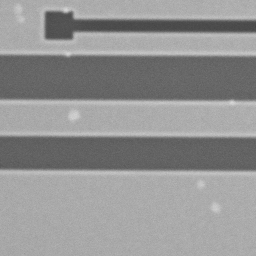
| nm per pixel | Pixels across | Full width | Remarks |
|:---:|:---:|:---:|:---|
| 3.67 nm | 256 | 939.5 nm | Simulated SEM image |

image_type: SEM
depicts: groups of lines, slits or small figures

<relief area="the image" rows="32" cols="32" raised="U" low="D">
UUUUUUUUUUUUUUUUUUUUUUUUUUUUUUUU
UUUUUUDDDUUUUUUUUUUUUUUUUUUUUUUU
UUUUUDDDDDDDDDDDDDDDDDDDDDDDDDDD
UUUUUDDDDDDDDDDDDDDDDDDDDDDDDDDD
UUUUUUDDDUUUUUUUUUUUUUUUUUUUUUUU
UUUUUUUUUUUUUUUUUUUUUUUUUUUUUUUU
UUUUUUUUUUUUUUUUUUUUUUUUUUUUUUUU
DDDDDDDDDDDDDDDDDDDDDDDDDDDDDDDD
DDDDDDDDDDDDDDDDDDDDDDDDDDDDDDDD
DDDDDDDDDDDDDDDDDDDDDDDDDDDDDDDD
DDDDDDDDDDDDDDDDDDDDDDDDDDDDDDDD
DDDDDDDDDDDDDDDDDDDDDDDDDDDDDDDD
DDDDDDDDDDDDDDDDDDDDDDDDDDDDDDDD
UUUUUUUUUUUUUUUUUUUUUUUUUUUUUUUU
UUUUUUUUUUUUUUUUUUUUUUUUUUUUUUUU
UUUUUUUUUUUUUUUUUUUUUUUUUUUUUUUU
UUUUUUUUUUUUUUUUUUUUUUUUUUUUUUUU
DDDDDDDDDDDDDDDDDDDDDDDDDDDDDDDD
DDDDDDDDDDDDDDDDDDDDDDDDDDDDDDDD
DDDDDDDDDDDDDDDDDDDDDDDDDDDDDDDD
DDDDDDDDDDDDDDDDDDDDDDDDDDDDDDDD
UUUUUUUUUUUUUUUUUUUUUUUUUUUUDDDD
UUUUUUUUUUUUUUUUUUUUUUUUUUUUUUUU
UUUUUUUUUUUUUUUUUUUUUUUUUUUUUUUU
UUUUUUUUUUUUUUUUUUUUUUUUUUUUUUUU
UUUUUUUUUUUUUUUUUUUUUUUUUUUUUUUU
UUUUUUUUUUUUUUUUUUUUUUUUUUUUUUUU
UUUUUUUUUUUUUUUUUUUUUUUUUUUUUUUU
UUUUUUUUUUUUUUUUUUUUUUUUUUUUUUUU
UUUUUUUUUUUUUUUUUUUUUUUUUUUUUUUU
UUUUUUUUUUUUUUUUUUUUUUUUUUUUUUUU
UUUUUUUUUUUUUUUUUUUUUUUUUUUUUUUU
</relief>